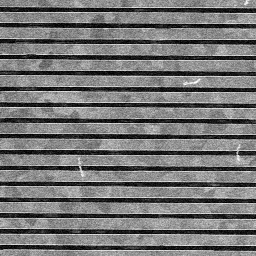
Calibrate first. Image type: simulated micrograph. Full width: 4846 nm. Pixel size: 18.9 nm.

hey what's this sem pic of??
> parallel lines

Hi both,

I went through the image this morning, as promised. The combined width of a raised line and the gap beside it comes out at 15.8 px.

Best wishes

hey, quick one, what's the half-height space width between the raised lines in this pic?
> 104 nm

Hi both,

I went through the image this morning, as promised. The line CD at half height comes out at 201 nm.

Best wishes